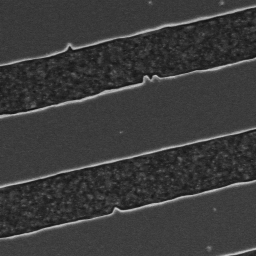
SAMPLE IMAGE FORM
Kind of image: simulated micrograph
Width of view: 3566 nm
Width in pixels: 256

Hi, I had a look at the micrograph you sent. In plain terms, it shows one or a few lines or trenches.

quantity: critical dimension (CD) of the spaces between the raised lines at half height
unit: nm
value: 702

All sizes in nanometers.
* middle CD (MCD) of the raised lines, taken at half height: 964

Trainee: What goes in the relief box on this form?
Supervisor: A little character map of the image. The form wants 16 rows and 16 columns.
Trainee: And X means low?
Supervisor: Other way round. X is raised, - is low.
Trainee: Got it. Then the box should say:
XXXXXXXXXXXXXXXX
XXXXXXXXXXX-----
XXXXXXX---------
XXX-------------
------------XXXX
--------XXXXXXXX
----XXXXXXXXXXXX
XXXXXXXXXXXXXXXX
XXXXXXXXXXXXXX--
XXXXXXXXXX------
XXXXX-----------
X--------------X
-----------XXXXX
------XXXXXXXXXX
--XXXXXXXXXXXXXX
XXXXXXXXXXXXXXXX